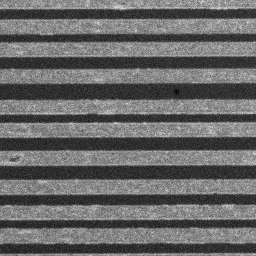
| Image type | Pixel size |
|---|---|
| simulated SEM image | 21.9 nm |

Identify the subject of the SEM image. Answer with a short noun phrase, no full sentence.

parallel lines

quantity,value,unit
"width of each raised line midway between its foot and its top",304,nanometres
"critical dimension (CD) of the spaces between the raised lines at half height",0.26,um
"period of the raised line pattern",573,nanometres